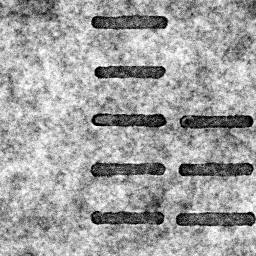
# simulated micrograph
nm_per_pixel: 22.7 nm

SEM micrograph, holes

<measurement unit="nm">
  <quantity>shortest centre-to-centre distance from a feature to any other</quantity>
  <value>1100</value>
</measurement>